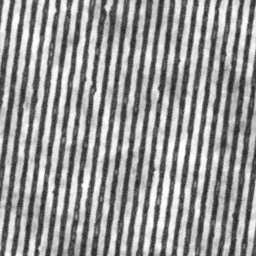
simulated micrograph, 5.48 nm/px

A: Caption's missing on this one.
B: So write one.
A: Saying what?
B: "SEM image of parallel lines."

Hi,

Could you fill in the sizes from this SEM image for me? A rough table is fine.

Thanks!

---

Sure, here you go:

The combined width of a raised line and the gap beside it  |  11.4 pixels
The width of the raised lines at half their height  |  0.0298 microns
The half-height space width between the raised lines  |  0.0346 um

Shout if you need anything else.